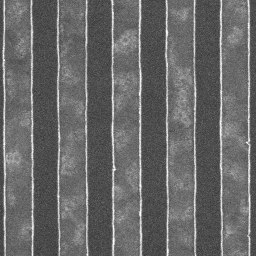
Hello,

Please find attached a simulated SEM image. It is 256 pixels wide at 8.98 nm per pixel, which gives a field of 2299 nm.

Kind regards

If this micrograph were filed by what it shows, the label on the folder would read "parallel lines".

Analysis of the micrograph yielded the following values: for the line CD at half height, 247 nanometres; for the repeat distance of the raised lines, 487 nm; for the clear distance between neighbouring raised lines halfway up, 247 nanometres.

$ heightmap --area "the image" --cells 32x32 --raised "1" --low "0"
10001110000111000111100011110001
10001110000111000111100011110001
10001110000111000111100011110001
10001110000111000011100011110001
10001110000111000111100011110001
00001110000111000111100011110001
00001110000111000111100011110001
00001110000111000111100011110001
00001110000111000011100011110001
00001110000111000011100011110001
10001110000111000011100011110001
10001110000111000011100011110001
10001110000111000011100011110001
10001110000111000011100011110001
00001110000111000011100011110001
10001110000111000011100011110001
00001110000111000011100011110001
00001110000111000011100011110001
00001110000111000011100011110001
10001110000111000011100011110001
10001110000111000011100011110001
10001110000111000011100011110001
10001110000111000011100011110001
10001110000111000011100011110001
10001110000111000011100011110001
10001110000111000011100011110001
10001110000111000011100011110001
10001110000111000011100011110001
10001110000111000011100011110001
10001110000111000011100011110001
10001110000111000011100011110001
10001110000111000011100011110001